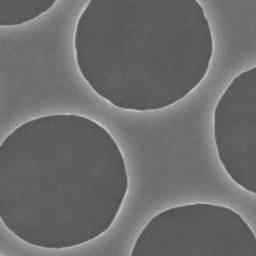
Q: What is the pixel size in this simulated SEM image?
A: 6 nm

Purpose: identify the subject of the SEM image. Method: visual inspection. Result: holes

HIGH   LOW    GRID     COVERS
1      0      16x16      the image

0001100000000111
0111100000000111
1111100000000111
1111100000000111
1111100000000110
1111110000001100
1111111000011100
1100001111111000
1000000111111000
0000000011111100
0000000011111100
0000000011111110
0000000011111111
0000000111000001
1000001110000000
1110111100000000